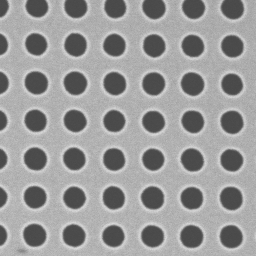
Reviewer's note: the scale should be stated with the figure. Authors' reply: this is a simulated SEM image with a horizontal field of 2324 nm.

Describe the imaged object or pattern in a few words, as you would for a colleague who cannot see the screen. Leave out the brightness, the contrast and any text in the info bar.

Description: a regular array of holes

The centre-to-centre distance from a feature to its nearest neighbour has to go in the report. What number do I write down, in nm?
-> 345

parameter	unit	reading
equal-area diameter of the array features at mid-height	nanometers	210